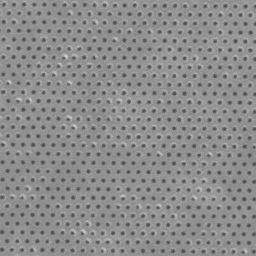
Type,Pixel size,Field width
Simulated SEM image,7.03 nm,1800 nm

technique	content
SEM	a regular array of holes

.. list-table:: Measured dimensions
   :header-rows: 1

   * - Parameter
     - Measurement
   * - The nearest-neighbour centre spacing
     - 69.1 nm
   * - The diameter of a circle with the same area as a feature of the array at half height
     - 28.6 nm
